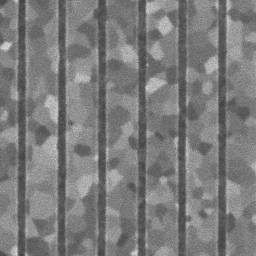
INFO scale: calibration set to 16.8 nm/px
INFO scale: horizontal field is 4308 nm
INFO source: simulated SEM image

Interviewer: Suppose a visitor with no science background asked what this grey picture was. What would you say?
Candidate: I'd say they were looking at parallel lines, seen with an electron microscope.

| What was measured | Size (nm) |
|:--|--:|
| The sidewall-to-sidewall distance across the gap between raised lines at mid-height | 149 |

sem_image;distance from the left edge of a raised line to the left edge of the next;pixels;40.1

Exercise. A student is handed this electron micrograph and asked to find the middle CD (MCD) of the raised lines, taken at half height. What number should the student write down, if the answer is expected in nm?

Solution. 520